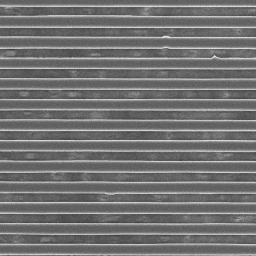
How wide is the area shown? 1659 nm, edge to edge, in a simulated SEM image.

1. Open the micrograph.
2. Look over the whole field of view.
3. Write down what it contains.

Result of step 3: parallel lines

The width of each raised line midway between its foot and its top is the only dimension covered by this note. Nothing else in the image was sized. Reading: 72.9 nanometers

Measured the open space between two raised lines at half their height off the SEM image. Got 60.8 nanometres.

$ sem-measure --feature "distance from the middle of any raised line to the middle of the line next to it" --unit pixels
20.7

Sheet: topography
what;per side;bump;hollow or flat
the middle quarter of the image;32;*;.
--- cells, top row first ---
********************************
................................
................................
................................
********************************
********************************
................................
................................
................................
********************************
********************************
................................
................................
................................
********************************
********************************
********************************
................................
................................
********************************
********************************
********************************
................................
................................
********************************
********************************
********************************
................................
................................
....*******................*****
********************************
********************************